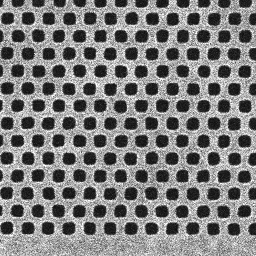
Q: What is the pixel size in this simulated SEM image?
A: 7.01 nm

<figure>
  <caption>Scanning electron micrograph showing a regular array of holes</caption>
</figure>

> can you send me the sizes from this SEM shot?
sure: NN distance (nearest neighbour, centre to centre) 139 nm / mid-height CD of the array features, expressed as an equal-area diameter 94.6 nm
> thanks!